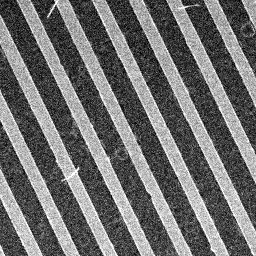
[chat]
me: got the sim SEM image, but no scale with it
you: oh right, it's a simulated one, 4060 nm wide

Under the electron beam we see parallel lines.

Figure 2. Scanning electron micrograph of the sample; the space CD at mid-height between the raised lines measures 342 nm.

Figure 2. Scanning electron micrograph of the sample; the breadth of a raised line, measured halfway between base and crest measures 192 nanometres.